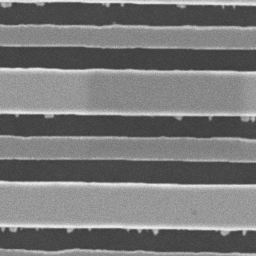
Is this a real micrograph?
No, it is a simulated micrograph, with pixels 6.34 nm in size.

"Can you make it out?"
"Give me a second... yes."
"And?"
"lines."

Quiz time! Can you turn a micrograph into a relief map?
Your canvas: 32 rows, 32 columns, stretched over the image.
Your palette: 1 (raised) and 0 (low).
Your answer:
00000000000000000000000111111111
00000000000000000000000000000000
00000000000000000000000000000000
11111111111111111111111111111111
11111111111111111111111111111111
11111111111111111111111111111111
00000000000000000000000000000000
00000000000000000000000000000000
00000000000000000000000000000000
11111111111111111111111111111111
11111111111111111111111111111111
11111111111111111111111111111111
11111111111111111111111111111111
11111111111111111111111111111111
00000000000000000000000000000000
00000000000000000000000000000000
00000000000000000000000000000000
11111111111111111111111111111111
11111111111111111111111111111111
11111111111111111111111111111111
00000000000000000000000000000000
00000000000000000000000000000000
00000000000000000000000000000000
11111111111111111111111111111111
11111111111111111111111111111111
11111111111111111111111111111111
11111111111111111111111111111111
11111111111111111111111111111111
00000000000000011111111111111111
00000000000000000000000000000000
00000000000000000000000000000000
11111111111111111110000000000000